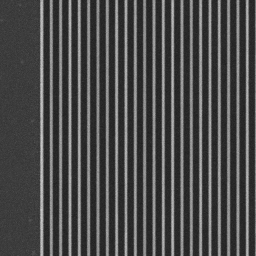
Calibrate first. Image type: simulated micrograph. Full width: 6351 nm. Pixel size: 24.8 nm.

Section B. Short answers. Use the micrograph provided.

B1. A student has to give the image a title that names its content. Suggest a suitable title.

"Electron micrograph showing parallel lines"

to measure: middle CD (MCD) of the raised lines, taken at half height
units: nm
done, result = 43.4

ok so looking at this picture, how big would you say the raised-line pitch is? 231 nm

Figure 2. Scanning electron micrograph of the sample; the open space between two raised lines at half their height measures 0.174 microns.